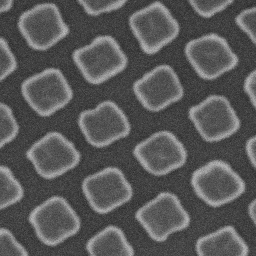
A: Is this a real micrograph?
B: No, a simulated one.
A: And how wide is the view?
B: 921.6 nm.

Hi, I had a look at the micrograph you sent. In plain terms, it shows a regular array of raised bodies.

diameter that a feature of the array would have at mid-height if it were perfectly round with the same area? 44 pixels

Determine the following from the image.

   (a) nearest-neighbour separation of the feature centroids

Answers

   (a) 223 nm